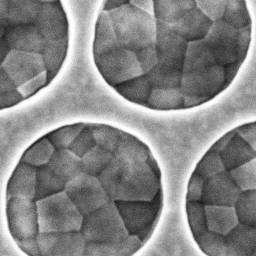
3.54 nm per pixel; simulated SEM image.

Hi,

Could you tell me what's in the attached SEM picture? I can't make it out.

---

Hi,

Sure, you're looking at holes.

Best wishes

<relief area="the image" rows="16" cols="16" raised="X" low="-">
----XX----------
----XX----------
----XX----------
----XX---------X
----XX---------X
---XXXX-------XX
-XXXXXXX-----XXX
XXXXXXXXXXXXXXXX
XXX-----XXXXXX--
X--------XXXX---
X---------XX----
----------XX----
----------XX----
----------XX----
X---------XX----
X--------XXX----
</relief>